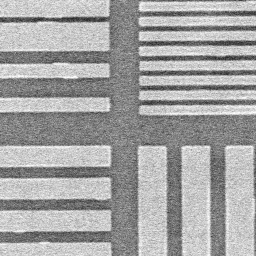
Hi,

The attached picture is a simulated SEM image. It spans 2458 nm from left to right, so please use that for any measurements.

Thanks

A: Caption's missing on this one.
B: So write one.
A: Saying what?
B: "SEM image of groups of lines, slits or small figures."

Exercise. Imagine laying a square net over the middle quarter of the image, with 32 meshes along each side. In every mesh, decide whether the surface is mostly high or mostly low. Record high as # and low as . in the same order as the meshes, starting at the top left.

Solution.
###########........#############
###########........#............
###########.....................
...................#############
...................#############
................................
................................
...................#############
...................#############
###########.....................
###########........#####........
###########........#############
...................######.......
................................
................................
................................
................................
................................
................................
................................
................................
###########........######.....##
###########........######.....##
###########........######.....##
###########........######.....##
#####..............######.....##
...................######.....##
...................######.....##
...................######.....##
###########........######.....##
###########........######.....##
###########........######.....##